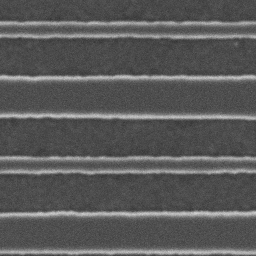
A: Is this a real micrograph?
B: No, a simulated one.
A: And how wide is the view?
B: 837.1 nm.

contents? lines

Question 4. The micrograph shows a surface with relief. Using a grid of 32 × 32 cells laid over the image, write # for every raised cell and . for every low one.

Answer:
................................
................................
................................
################################
################################
................................
................................
................................
................................
#.............###.#...........##
################################
################################
################################
################################
################################
................................
................................
................................
................................
................................
################################
##############################.#
................................
................................
................................
................................
...............................#
################################
################################
################################
################################
################################